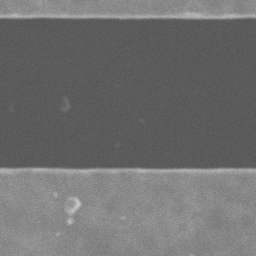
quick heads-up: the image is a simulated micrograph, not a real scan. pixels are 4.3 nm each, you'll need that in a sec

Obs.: wiring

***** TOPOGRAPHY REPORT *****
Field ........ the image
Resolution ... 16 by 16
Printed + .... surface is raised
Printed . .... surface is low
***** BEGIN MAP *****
++++++++++++++++
................
................
................
................
................
................
................
................
................
................
++++++++++++++++
++++++++++++++++
++++++++++++++++
++++++++++++++++
++++++++++++++++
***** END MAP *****